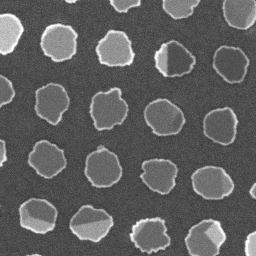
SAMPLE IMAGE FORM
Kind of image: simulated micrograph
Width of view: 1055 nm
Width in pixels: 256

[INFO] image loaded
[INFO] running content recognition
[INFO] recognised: a regular array of raised bodies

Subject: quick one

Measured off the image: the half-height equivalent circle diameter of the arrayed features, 149 nanometres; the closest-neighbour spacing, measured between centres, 233 nanometers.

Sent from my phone